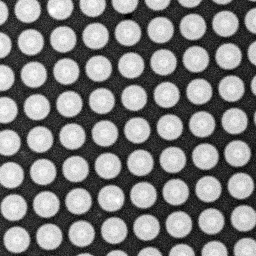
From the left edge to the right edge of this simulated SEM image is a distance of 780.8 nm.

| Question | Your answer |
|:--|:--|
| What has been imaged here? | an array of small figures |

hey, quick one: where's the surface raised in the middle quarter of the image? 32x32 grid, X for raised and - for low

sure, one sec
XXX---XXXXXX--XXXXXX--XXXXXX--XX
XXXX-XXXXXXX--XXXXXX--XXXXXX---X
XXXX--XXXXXX--XXXXX-----XX------
XXX----XXXX---------------------
XX------------------------------
----------------XX-----XXXXX---X
--------XXX----XXXXX---XXXXXX--X
XXX----XXXXX---XXXXX---XXXXXX--X
XXXX--XXXXXXX-XXXXXXX--XXXXXX--X
XXXX--XXXXXXX--XXXXX---XXXXX----
XXXX---XXXXX---XXXXX----XXX-----
XXXX---XXXXX-----X--------------
XXX-----------------------------
------------------X-----XXXXX---
---------XXX----XXXXX---XXXXX--X
XXXX----XXXXX--XXXXXX--XXXXXXX-X
XXXXX--XXXXXX--XXXXXX--XXXXXXX--
XXXXX--XXXXXX--XXXXXX---XXXXX---
XXXXX--XXXXXX---XXXXX----XXX----
XXXXX---XXXXX----XXX------------
XXXX------X---------------------
-------------------------XXXX---
----------XX-----XXXX---XXXXXX--
-XXX----XXXXX---XXXXXX--XXXXXX--
XXXXXX--XXXXXX--XXXXXX--XXXXXX--
XXXXXX--XXXXXX--XXXXXX--XXXXXX--
XXXXXX--XXXXXX--XXXXXX---XXXX---
XXXXXX---XXXX----XXXX-----------
-XXXX-----XX--------------------
--------------------------XXXX--
-----------XX-----XXXX---XXXXXX-
--XXX----XXXXX---XXXXXX--XXXXXX-